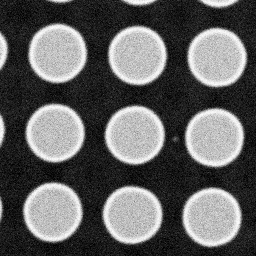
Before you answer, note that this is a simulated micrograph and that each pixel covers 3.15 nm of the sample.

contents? an array of small figures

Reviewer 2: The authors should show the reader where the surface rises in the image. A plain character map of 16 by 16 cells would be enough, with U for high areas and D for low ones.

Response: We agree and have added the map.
DDDDDDDDDDDDDDDD
DDDDDDDDDDDDDDDD
DDUUUDDUUUDDUUUD
DDUUUDDUUUDDUUUD
DDUUUDDUUUDDUUUD
DDDDDDDDDDDDDDDD
DDDDDDDDDDDDDDDD
DDUUUDDUUUDDUUUD
DDUUUDDUUUDDUUUD
DDUUUDDUUUDDUUUD
DDDDDDDDDDDDDDDD
DDDDDDDDDDDDDDDD
DDUUUDDUUUDDUUUD
DDUUUDDUUUDUUUUD
DDUUUDDUUUDDUUUD
DDDDDDDDDDDDDDDD